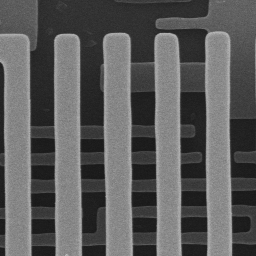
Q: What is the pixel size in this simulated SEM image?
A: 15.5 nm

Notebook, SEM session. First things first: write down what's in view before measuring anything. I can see wiring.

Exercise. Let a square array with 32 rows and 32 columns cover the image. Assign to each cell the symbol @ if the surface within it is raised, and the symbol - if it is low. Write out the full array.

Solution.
--------------------------------
--------------------------------
--------------------------------
--------------------------------
@@@----@@@---@@@----@@----@@@---
@@@@---@@@---@@@---@@@----@@@---
@@@@---@@@---@@@---@@@----@@@---
@@@@---@@@---@@@---@@@----@@@---
@@@@---@@@---@@@---@@@----@@@---
-@@@---@@@---@@@---@@@----@@@---
-@@@---@@@---@@@---@@@----@@@---
-@@@---@@@---@@@---@@@----@@@---
-@@@---@@@---@@@----@@----@@@---
-@@@---@@@---@@@---@@@----@@@---
-@@@---@@@---@@@---@@@----@@@---
-@@@---@@@---@@@---@@@----@@@---
-@@@---@@@---@@@---@@@----@@@---
-@@@---@@@---@@@----@@----@@@---
-@@@---@@@---@@@----@@@---@@@---
-@@@---@@@---@@@----@@@---@@@---
-@@@---@@@---@@@----@@@---@@@---
-@@@---@@@---@@@----@@@---@@@---
-@@@---@@@---@@@----@@@---@@@---
-@@@---@@@---@@@----@@@---@@@---
-@@@---@@@---@@@----@@@---@@@---
-@@@---@@@---@@@----@@@---@@@---
-@@@---@@@---@@@----@@@---@@@---
-@@@---@@@---@@@----@@@---@@@---
-@@@---@@@---@@@----@@@---@@@---
-@@@---@@@---@@@----@@@---@@@---
-@@@---@@@---@@@@---@@@---@@@---
-@@@---@@@---@@@@---@@@---@@@---